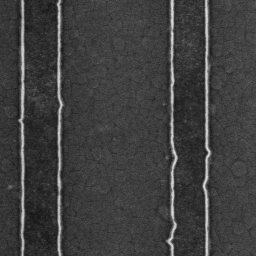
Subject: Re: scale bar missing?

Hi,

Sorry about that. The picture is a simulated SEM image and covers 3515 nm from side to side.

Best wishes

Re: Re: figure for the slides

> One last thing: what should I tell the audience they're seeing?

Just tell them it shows one or a few lines or trenches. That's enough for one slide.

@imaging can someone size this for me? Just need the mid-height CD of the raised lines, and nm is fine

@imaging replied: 487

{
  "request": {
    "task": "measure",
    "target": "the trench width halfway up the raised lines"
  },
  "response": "113 px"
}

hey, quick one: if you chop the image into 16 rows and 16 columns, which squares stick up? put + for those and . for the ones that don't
.+++.......++...
.+++.......++...
.+++.......++...
.+++.......++...
.+++.......++...
.+++.......++...
.+++.......++...
.+++.......++...
.+++.......++...
.+++.......++...
.+++.......++...
.+++.......++...
.+++.......++...
.+++.......++...
.+++.......++...
.+++.......++...